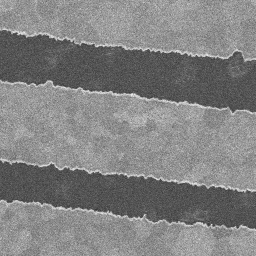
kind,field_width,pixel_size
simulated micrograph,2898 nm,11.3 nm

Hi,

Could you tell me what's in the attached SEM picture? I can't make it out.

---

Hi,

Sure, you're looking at one or a few lines or trenches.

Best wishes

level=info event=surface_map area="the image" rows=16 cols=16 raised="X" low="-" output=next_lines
XXXXXXXXXXXXXXXX
XXXXXXXXXXXXXXXX
----XXXXXXXXXXXX
-------------X-X
----------------
XXXX------------
XXXXXXXXXXXX----
XXXXXXXXXXXXXXXX
XXXXXXXXXXXXXXXX
XXXXXXXXXXXXXXXX
----XXXXXXXXXXXX
------------XXXX
----------------
XXXXXXX---------
XXXXXXXXXXXXXXXX
XXXXXXXXXXXXXXXX